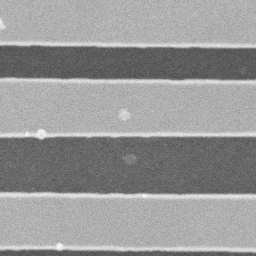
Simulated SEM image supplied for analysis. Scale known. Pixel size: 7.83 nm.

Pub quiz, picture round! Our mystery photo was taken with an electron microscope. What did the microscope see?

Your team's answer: lines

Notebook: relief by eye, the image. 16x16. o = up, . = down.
oooooooooooooooo
oooooooooooooooo
oooooooooooooooo
................
................
oooooooooooooooo
oooooooooooooooo
oooooooooooooooo
oooo.o..........
................
................
................
oooooooooooooooo
oooooooooooooooo
oooooooooooooooo
oooooooooooooooo